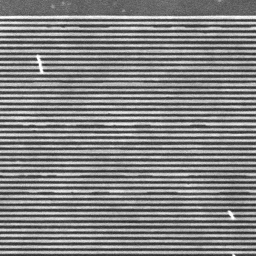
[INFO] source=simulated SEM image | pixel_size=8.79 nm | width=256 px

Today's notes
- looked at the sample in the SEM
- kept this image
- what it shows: parallel lines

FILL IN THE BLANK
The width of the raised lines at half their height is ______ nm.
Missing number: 17.6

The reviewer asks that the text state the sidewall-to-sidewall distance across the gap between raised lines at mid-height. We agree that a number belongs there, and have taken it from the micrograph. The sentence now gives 26.4 nanometres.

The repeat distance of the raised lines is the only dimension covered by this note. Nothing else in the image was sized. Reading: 49.1 nm